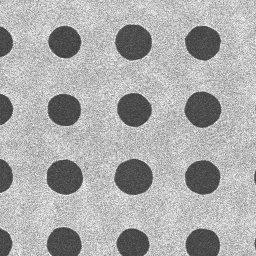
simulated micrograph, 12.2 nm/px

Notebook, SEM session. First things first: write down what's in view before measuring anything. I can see a regular array of holes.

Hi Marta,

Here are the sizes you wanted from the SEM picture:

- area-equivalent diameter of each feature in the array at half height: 426 nanometres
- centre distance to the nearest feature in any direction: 823 nm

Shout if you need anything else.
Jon